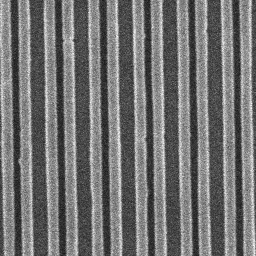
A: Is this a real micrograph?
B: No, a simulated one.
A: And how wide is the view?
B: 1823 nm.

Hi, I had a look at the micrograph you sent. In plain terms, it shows parallel lines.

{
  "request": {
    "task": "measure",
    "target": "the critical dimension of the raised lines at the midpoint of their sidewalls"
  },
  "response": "69.4 nanometers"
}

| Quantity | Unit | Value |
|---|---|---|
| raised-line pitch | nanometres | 156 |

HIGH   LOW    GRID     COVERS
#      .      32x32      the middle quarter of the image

##.....##..##.....##..##.....##.
##.....##..##.....##..##.....##.
##.....##..##.....##..###....##.
##.....##..##.....##..###....##.
##.....##..##.....##..###....##.
###....##..##.....##..###....##.
###....##..##.....##..###....##.
##.....##..##.....##..###....##.
##.....##..##.....##..###....##.
##.....##..###....##..###....##.
##.....##..###....##..###....##.
##.....##..###....##..###....##.
##.....##..###....##..###....##.
##.....##..###....##..###....##.
##.....##..##.....##...##....##.
##.....##..##.....##...##....##.
###....##...##....##...##....##.
###....##...##....##...##....###
###....##...##....##...##....##.
###....##..###....##...##....##.
###....##..###....##...##....##.
###....##..###....##...##....##.
###....##..###....##...##....##.
###....##..###....##...##....##.
###....##..###....##...##....##.
###....##..###....##...##....##.
###....##..###....##...##....##.
###....##..###....##...##....##.
.##....##...##....##...##....###
.##....##...##....##...##....###
.##....##...##....###..##....##.
.##....##...##....###..##....###